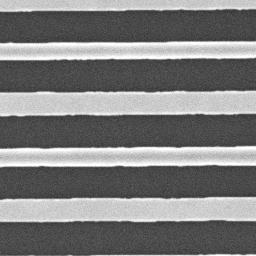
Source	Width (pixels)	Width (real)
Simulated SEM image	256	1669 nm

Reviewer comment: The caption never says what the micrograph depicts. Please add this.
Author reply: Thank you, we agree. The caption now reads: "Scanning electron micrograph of lines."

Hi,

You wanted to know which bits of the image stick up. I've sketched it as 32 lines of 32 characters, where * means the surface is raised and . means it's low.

********************************
................................
................................
................................
................................
********************************
********************************
................................
................................
................................
................................
.....................**....*****
********************************
********************************
................................
................................
................................
................................
.............*.*****************
********************************
********************************
................................
................................
................................
................................
********************************
********************************
***************************.****
................................
................................
................................
................................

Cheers